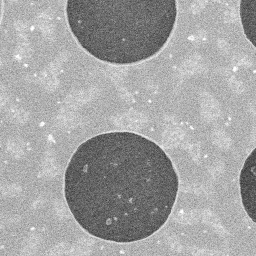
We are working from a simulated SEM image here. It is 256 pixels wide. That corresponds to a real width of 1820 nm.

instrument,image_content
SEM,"holes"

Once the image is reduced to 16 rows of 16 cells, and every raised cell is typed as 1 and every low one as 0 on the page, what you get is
1111000000011110
1111000000011110
1111100000111111
1111110001111111
1111111111111111
1111111111111111
1111111111111111
1111111111111111
1111110001111111
1111100000111111
1111000000011110
1111000000011110
1111000000011110
1111100000011111
1111100000111111
1111111111111111